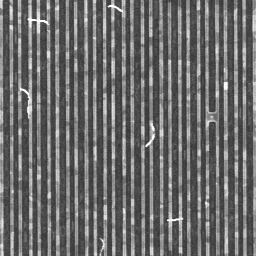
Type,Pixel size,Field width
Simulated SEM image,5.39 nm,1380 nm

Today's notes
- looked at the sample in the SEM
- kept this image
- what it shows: parallel lines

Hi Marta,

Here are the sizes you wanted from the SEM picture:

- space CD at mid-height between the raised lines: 7.38 pixels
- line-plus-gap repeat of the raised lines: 50.2 nm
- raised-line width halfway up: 13.5 nm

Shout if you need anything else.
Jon